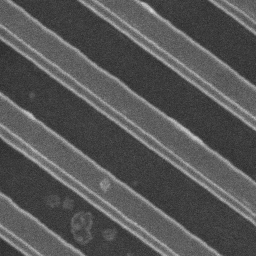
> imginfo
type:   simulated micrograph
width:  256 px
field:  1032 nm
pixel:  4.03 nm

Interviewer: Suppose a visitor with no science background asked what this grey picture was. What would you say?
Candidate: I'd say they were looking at lines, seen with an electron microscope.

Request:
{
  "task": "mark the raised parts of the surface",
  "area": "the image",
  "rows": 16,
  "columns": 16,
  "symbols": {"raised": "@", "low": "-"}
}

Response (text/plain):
@-----@@@-----@@
@@@----@@@@----@
@@@@----@@@@----
--@@@-----@@@---
---@@@@----@@@@-
----@@@@----@@@@
@-----@@@-----@@
@@-----@@@@----@
@@@@----@@@@----
-@@@@-----@@@---
---@@@-----@@@@-
----@@@@-----@@@
@----@@@@-----@@
@@-----@@@-----@
@@@-----@@@@----
-@@@@-----@@@---